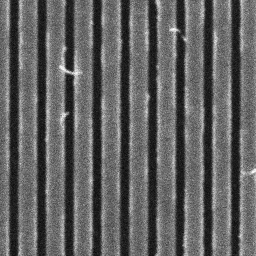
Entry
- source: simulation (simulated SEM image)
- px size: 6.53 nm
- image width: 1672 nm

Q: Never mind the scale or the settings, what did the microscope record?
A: parallel lines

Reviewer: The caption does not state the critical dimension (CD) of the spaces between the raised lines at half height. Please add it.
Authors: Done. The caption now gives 0.0571 microns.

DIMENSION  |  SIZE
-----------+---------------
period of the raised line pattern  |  181 nanometers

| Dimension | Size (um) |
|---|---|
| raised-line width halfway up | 0.121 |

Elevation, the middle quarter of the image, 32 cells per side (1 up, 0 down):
00011110011111000111100111110011
10011110011111000111100011110011
00111110011111001111100011110011
00011110011111001111100111110011
00111110011111001111100111110011
00011110011111001111100011110011
00011110011111001111100111110011
00011110011111001111100011110011
00011110011111001111100111110011
00011110011111001111100111110011
00011110011111001111100111110011
00011110011111001111100111110011
10011110011111001111100111110011
00011110011111001111100111110011
00011110011111001111100111110011
00011110011111001111100111110011
00011110011111001111100111110011
00011110011111001111100111110011
00011110011111001111100111110011
00011110011111001111100111110011
00011110011111001111100111110011
00011110011111001111100111110011
00011110011111001111100111110011
00011110011111001111100111110011
00011110011111001111100111110011
00011110011111001111100111110011
00011110011111001111100111110011
00011110011111001111100111110011
00011110011111001111100111110011
00011110011111001111100111110011
00011110011111001111100111110011
00011110011111001111100111110011